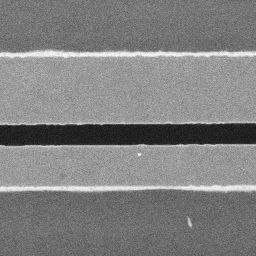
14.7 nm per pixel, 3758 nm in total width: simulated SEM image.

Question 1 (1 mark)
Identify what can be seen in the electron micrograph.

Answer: lines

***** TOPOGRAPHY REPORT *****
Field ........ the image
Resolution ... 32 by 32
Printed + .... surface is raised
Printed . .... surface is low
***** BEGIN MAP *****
................................
................................
................................
................................
................................
................................
................................
++++++++++++++++++++++++++++++++
++++++++++++++++++++++++++++++++
++++++++++++++++++++++++++++++++
++++++++++++++++++++++++++++++++
++++++++++++++++++++++++++++++++
++++++++++++++++++++++++++++++++
++++++++++++++++++++++++++++++++
++++++++++++++++++++++++++++++++
+++++++++++.+...................
................................
................................
++++++++++++++++++++++++++++++++
++++++++++++++++++++++++++++++++
++++++++++++++++++++++++++++++++
++++++++++++++++++++++++++++++++
++++++++++++++++++++++++++++++++
................................
................................
................................
................................
................................
................................
................................
................................
................................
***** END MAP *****